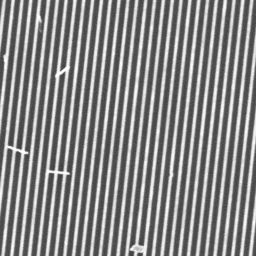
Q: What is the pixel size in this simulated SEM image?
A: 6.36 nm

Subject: parallel lines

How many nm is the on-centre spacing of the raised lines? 55.9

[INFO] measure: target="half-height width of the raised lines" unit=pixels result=2.74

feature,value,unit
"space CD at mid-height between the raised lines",41.9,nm